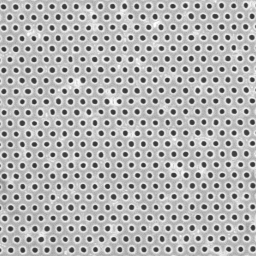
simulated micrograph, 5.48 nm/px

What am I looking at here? a regular array of holes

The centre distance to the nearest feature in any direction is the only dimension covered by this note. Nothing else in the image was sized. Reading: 63.9 nm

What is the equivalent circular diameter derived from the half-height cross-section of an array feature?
29 nanometers